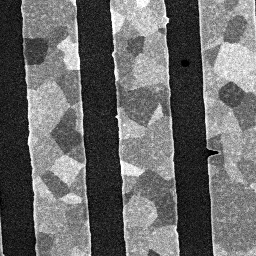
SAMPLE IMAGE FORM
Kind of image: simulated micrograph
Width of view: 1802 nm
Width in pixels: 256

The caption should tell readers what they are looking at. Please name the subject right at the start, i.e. one or a few lines or trenches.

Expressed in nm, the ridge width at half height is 380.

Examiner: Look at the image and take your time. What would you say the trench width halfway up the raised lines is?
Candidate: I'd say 244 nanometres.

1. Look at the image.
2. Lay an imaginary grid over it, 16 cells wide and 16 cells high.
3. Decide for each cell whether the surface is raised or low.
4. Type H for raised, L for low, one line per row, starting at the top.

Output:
LHHHHLLHHHLLHHHH
LHHHHLLHHHLLHHHH
LHHHHLLHHHLLLHHH
LLHHHLLHHHLLLHHH
LLHHHLLHHHHLLHHH
LLHHHLLHHHHLLHHH
LLHHHLLHHHHLLHHH
LLHHHLLHHHHLLHHH
LLHHHLLHHHHLLHHH
LLHHHLLHHHHLLHHH
LLHHHLLLHHHLLHHH
LLHHHLLLHHHLLHHH
LLHHHLLLHHHLLHHH
LLHHHHLLHHHLLHHH
LLHHHHLLHHHLLHHH
LLHHHHLLHHHLLHHH